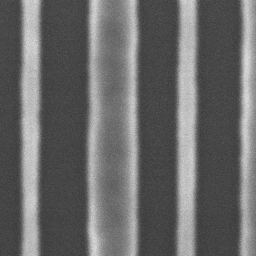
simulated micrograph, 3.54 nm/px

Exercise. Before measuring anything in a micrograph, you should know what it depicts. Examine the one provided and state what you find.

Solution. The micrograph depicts lines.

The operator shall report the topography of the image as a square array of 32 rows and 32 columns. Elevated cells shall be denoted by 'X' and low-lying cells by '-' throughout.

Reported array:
---XX-------XXXXX-----XX------XX
---XX-------XXXXX------X------XX
---XX------XXXXXX------X-------X
---XX-------XXXXX------X-------X
---XX------XXXXXX-----XX-------X
---XX------XXXXXX-----XX-------X
---XX------XXXXXX-----XX-------X
---XX------XXXXXX-----XX-------X
---XX------XXXXXX-----XX-------X
---XX------XXXXXX-----XX------XX
---XX------XXXXXX-----XX------XX
---XX-------XXXXX-----XX------XX
---XX-------XXXXX-----XX------XX
---XX-------XXXXX-----XX-------X
---XX-------XXXXX-----XX------XX
---XX-------XXXXX-----XX------XX
---XX------XXXXXX-----XX------XX
---XX------XXXXXX-----XX------XX
---XX------XXXXXX-----XX------XX
---XX------XXXXXX-----XX------XX
---XX------XXXXXX-----XX------XX
---XX------XXXXXX-----XX------XX
---XX------XXXXXX-----XX------XX
---XX------XXXXXX-----XX------XX
---XX------XXXXXX-----XX------XX
---XX------XXXXXX-----XX------XX
---XX------XXXXXX-----XX------XX
---XX------XXXXXX-----XX------XX
---XX------XXXXXX-----XX------XX
---XX------XXXXXX-----XX------XX
---XX-------XXXXX-----XX------XX
---XX-------XXXXX-----XX------XX